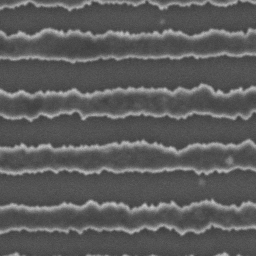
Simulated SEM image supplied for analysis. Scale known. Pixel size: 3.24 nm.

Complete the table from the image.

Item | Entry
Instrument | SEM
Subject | lines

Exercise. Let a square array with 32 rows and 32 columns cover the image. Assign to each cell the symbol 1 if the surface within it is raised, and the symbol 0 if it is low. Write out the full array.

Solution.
11101111111000001001101100011000
00000000000000000000000000000000
00000000000000000000000000000000
00000000000000000000000000000000
11111111111111111111111011111111
11111111111111111111111111111111
11111111111111111111111111111111
00000000111100000000000000000000
00000000000000000000000000000000
00000000000000000000000000000000
00000000000000000000000000000000
10100000110001111111111111100111
11111111111111111111111111111111
11111111111111111111111111111111
11111010001000110001011000011110
00000000000000000000000000000000
00000000000000000000000000000000
00000000000000000000000000000000
00111110101111111111100111111111
11111111111111111111111111111111
11111111111111111111111111111111
11111000001110100001000011000000
00000000000000000000000000000000
00000000000000000000000000000000
00000000000000000000000000000000
00000000000100000000000001100000
11111111111111111111111111111111
11111111111111111111111111111111
11111111111111111111011111011111
00000000000000000000000000000000
00000000000000000000000000000000
00000000000000000000000000000000